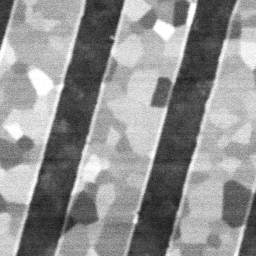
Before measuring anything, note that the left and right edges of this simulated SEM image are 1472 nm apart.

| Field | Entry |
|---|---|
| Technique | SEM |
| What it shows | one or a few lines or trenches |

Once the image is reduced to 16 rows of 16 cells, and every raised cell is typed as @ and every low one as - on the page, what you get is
-@@@@---@@@@---@
-@@@@---@@@@--@@
@@@@@--@@@@@--@@
@@@@---@@@@---@@
@@@@---@@@@---@@
@@@@--@@@@@--@@@
@@@---@@@@---@@@
@@@---@@@@---@@@
@@@---@@@@--@@@@
@@@--@@@@@--@@@@
@@---@@@@---@@@@
@@---@@@@---@@@@
@@--@@@@@--@@@@@
@@--@@@@---@@@@-
@---@@@@---@@@@-
@---@@@@---@@@@-